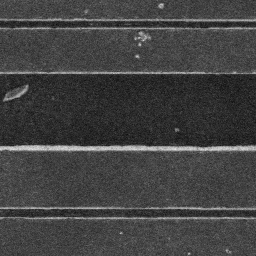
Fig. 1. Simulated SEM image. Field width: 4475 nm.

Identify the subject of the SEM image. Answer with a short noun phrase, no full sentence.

lines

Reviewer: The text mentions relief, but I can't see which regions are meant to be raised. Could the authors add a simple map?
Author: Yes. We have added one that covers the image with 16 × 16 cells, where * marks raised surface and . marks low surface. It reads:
****************
****************
****************
****************
****************
................
................
................
................
****************
****************
****************
****************
****************
****************
****************